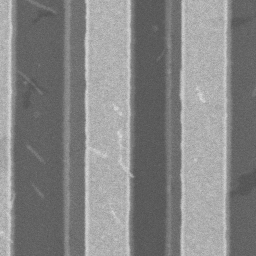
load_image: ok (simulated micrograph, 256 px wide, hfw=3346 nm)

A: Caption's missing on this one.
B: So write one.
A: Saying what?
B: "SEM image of lines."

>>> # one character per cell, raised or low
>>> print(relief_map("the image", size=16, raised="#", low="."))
#...####...###..
#...####...###..
#...####...###..
#...####...###..
#...####...###..
#...####...###..
#...####...###..
#...####...###..
#...####...###..
#...####...###..
#...####...###..
#...####...###..
#...####...###..
#...####...###..
#...####...###..
#...####...###..